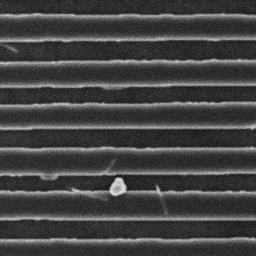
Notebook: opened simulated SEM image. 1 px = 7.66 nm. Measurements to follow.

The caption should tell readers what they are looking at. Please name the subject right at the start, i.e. lines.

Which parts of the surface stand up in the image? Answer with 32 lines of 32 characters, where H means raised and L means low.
LLLLLLLLLLLLLLLLLLLLLLLLLLLLLLLL
LLLLLLLLLLLLLLLLLLLLLLLLLLLLLLLL
HHHHHHHHHHHHHHHHHHHHHHHHHHHHHHHH
HHHHHHHHHHHHHHHHHHHHHHHHHHHHHHHH
HHHHHHHHHHHHHHHHHHHHHHHHHHHHHHHH
LLLLLLLLLLLLLLLLLLLLLLLLLLLLLLLL
LLLLLLLLLLLLLLLLLLLLLLLLLLLLLLLL
LLLLLLLLLLLLLLLLLLLLLLLLLLHLLHHL
HHHHHHHHHHHHHHHHHHHHHHHHHHHHHHHH
HHHHHHHHHHHHHHHHHHHHHHHHHHHHHHHH
HHHHHHHHHHHHHHHHHHHHHHHHHHHHHHHH
LLLLLLLLLLLLLLLLLLLLLLLLLLLLLLLL
LLLLLLLLLLLLLLLLLLLLLLLLLLLLLLLL
HHHHHHHHHHHHHHHHHHHHHHHHHHHHHHHH
HHHHHHHHHHHHHHHHHHHHHHHHHHHHHHHH
HHHHHHHHHHHHHHHHHHHHHHHHHHHHHHHH
LLLLLLLLLLLLLLLLLLLLLLLLLLLLLLLL
LLLLLLLLLLLLLLLLLLLLLLLLLLLLLLLL
LLLLLLLLLLLLHHLLLLLLLLHLLLLLLLLH
HHHHHHHHHHHHHHHHHHHHHHHHHHHHHHHH
HHHHHHHHHHHHHHHHHHHHHHHHHHHHHHHH
HHHHHHHHHHHHHHHHHHHHHHHHHHHHHHHH
LLLLLLLLLLLLLLLLLLLLLLLLLLLLLLLL
LLLLLLLLLLLLLLHHLLLLLLLLLLLLLLLL
HHHHHHHHHHHHHHHHHHHHHHHHHHHHHHHH
HHHHHHHHHHHHHHHHHHHHHHHHHHHHHHHH
HHHHHHHHHHHHHHHHHHHHHHHHHHHHHHHH
LLLLLLLLLLLLLLLLLLLLLLLLLLLLLLLL
LLLLLLLLLLLLLLLLLLLLLLLLLLLLLLLL
LLLLLLLLLLLLLLLLLLLLLLLLLLLLLLLL
HHHHHHHHHHHHHHHHHHHHHHHHHHHHHHHH
HHHHHHHHHHHHHHHHHHHHHHHHHHHHHHHH